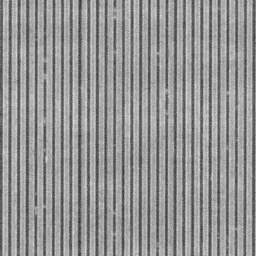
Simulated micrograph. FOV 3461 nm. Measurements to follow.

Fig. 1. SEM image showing parallel lines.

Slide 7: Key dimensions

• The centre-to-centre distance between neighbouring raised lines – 118 nanometers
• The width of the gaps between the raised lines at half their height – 49 nanometers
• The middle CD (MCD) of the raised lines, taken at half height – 4.5 pixels